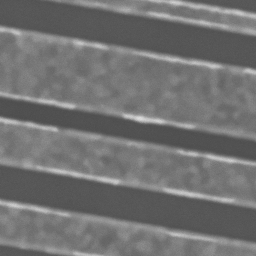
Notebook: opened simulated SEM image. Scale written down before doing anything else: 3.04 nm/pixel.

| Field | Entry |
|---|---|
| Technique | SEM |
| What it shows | one or a few lines or trenches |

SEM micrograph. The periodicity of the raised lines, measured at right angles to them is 240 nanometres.